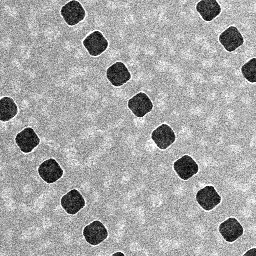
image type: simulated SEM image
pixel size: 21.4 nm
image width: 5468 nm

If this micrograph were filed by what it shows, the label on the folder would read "a regular array of holes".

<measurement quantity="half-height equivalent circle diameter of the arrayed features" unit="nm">506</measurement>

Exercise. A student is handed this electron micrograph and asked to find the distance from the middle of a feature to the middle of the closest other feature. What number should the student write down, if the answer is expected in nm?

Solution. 817